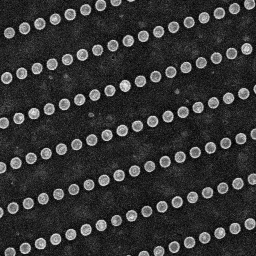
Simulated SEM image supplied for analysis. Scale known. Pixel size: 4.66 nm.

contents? a regular array of raised bodies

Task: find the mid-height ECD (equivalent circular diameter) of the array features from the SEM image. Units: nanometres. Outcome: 49.1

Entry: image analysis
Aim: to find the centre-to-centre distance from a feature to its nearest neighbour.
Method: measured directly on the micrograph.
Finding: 73.5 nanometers